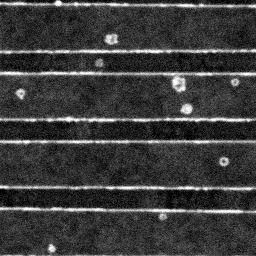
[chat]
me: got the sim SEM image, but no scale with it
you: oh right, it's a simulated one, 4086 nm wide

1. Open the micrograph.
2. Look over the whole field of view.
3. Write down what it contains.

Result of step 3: lines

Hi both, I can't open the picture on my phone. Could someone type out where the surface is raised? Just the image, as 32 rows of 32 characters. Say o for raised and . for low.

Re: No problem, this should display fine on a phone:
oooo..oo.o......................
oooooooooooooooooooooooooooooooo
oooooooooooooooooooooooooooooooo
oooooooooooooooooooooooooooooooo
oooooooooooooooooooooooooooooooo
oooooooooooooooooooooooooooooooo
................................
................................
................................
oooooooooooooooooooooooooooooooo
oooooooooooooooooooooooooooooooo
oooooooooooooooooooooooooooooooo
oooooooooooooooooooooooooooooooo
oooooooooooooooooooooooooooooooo
oooooooooooooooooooooooooooooooo
................................
................................
................................
oooooooooooooooooooooooooooooooo
oooooooooooooooooooooooooooooooo
oooooooooooooooooooooooooooooooo
oooooooooooooooooooooooooooooooo
oooooooooooooooooooooooooooooooo
........ooo..oooo..ooooooooooooo
................................
................................
ooooooooooooooooooooooooooooooo.
oooooooooooooooooooooooooooooooo
oooooooooooooooooooooooooooooooo
oooooooooooooooooooooooooooooooo
oooooooooooooooooooooooooooooooo
oooooooooooooooooooooooooooooooo